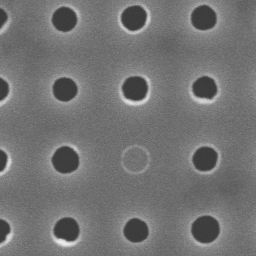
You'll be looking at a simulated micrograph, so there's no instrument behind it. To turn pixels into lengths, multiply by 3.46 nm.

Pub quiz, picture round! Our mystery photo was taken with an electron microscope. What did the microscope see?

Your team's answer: a regular array of holes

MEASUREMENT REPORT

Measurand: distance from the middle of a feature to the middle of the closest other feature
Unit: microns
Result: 0.241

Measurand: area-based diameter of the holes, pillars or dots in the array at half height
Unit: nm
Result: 87.8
